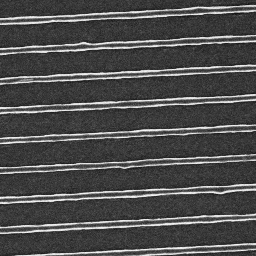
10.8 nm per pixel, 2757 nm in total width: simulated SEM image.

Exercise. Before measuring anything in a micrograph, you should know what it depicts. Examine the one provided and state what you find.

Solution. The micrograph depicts parallel lines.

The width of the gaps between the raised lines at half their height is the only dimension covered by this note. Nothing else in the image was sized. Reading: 259 nanometers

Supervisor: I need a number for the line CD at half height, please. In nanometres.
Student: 61.8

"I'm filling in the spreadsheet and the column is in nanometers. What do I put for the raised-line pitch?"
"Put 320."